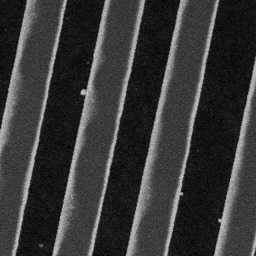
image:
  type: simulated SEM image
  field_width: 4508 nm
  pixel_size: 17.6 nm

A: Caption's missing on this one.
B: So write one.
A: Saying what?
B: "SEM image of lines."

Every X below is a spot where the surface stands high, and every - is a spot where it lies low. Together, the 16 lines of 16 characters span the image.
--XX---XX--XXX--
--XX--XXX--XX---
-XXX--XXX--XX---
-XX---XX---XX---
-XX---XX--XXX---
-XX---XX--XXX---
XXX--XXX--XX---X
XXX--XX---XX---X
XX---XX---XX---X
XX---XX--XXX---X
XX--XXX--XXX---X
XX--XXX--XX---XX
XX--XX---XX---XX
X---XX---XX---XX
X---XX--XXX---XX
X--XXX--XXX---XX